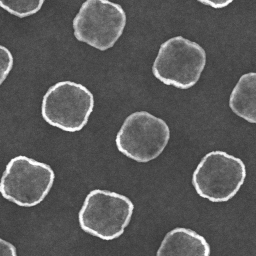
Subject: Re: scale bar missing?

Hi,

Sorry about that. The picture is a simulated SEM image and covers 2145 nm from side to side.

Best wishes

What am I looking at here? raised bodies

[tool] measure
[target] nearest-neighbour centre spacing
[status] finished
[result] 690 nm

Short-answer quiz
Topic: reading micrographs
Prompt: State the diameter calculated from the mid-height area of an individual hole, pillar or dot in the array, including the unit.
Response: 419 nm